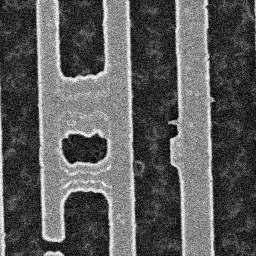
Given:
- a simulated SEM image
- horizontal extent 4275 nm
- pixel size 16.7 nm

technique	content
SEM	one or a few lines or trenches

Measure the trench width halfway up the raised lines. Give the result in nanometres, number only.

818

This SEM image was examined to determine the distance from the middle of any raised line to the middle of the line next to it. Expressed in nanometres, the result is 1200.